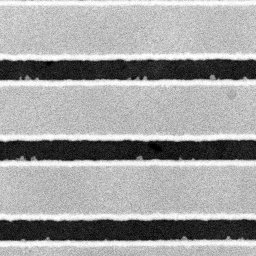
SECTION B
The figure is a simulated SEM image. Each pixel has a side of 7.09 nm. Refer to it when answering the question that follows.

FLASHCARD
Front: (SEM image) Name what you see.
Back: lines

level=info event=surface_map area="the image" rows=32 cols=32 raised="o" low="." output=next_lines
oooooooooooooooooooooooooooooooo
oooooooooooooooooooooooooooooooo
oooooooooooooooooooooooooooooooo
oooooooooooooooooooooooooooooooo
oooooooooooooooooooooooooooooooo
oooooooooooooooooooooooooooooooo
oooooooooooooooooooooooooooooooo
......o.........................
................................
................................
oooooooooooooooooooooooooooooooo
oooooooooooooooooooooooooooooooo
oooooooooooooooooooooooooooooooo
oooooooooooooooooooooooooooooooo
oooooooooooooooooooooooooooooooo
oooooooooooooooooooooooooooooooo
oooooooooooooooooooooooooooooooo
o..o.....o..ooo.ooo..oo.ooo.....
................................
................................
oooooooooooooooooooooooooooooooo
oooooooooooooooooooooooooooooooo
oooooooooooooooooooooooooooooooo
oooooooooooooooooooooooooooooooo
oooooooooooooooooooooooooooooooo
oooooooooooooooooooooooooooooooo
oooooooooooooooooooooooooooooooo
.o.....o.......o................
................................
................................
oooooooooooooooooooooooooooooooo
oooooooooooooooooooooooooooooooo